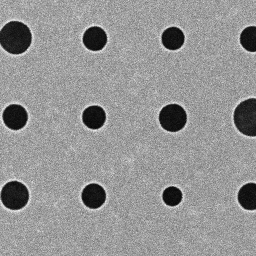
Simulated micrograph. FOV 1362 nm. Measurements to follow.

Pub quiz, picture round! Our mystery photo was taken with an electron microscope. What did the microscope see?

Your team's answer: a regular array of holes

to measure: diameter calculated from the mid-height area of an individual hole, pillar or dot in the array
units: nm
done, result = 131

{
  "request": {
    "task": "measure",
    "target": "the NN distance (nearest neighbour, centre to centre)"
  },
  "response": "417 nanometres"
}